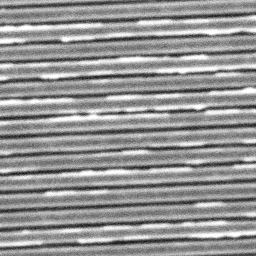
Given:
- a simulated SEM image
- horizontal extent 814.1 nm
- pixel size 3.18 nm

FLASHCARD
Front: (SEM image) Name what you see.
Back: parallel lines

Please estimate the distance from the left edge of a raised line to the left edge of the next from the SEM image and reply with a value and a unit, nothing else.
58.8 nanometres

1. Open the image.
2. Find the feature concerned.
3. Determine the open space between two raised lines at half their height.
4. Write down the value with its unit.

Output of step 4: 15.5 nm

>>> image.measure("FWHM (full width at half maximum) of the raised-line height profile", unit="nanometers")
42.5